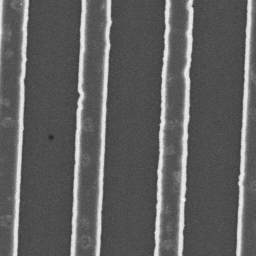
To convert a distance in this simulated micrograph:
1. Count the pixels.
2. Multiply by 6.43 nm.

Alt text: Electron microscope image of one or a few lines or trenches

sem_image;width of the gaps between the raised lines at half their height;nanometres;370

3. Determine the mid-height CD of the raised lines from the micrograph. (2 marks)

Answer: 162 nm